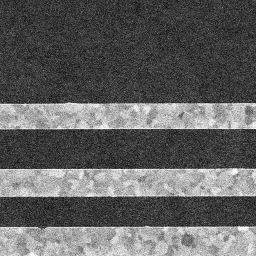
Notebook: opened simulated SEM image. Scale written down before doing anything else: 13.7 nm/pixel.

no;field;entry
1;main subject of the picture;one or a few lines or trenches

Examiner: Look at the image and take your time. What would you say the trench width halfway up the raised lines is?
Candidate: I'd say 501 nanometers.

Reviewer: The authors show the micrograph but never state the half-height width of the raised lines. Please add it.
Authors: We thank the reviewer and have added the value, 348 nm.